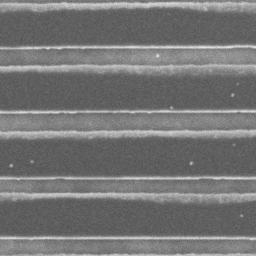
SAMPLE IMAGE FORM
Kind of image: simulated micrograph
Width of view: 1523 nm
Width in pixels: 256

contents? lines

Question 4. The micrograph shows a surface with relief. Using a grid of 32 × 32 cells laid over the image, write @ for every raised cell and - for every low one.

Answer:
---------------------@----------
@@@@@@@@@@@@@@@@@@@@@@@@@@@@@@@@
@@@@@@@@@@@@@@@@@@@@@@@@@@@@@@@@
@@@@@@@@@@@@@@@@@@@@@@@@@@@@@@@@
@@@@@@@@@@@@@@@@@@@@@@@@@@@@@@@@
@@@@@@@@@@@@@@@@@@@@@@@@@@@@@@@@
--------------------------------
--------------------------------
-@@@@--@@@@@-@@@@---------------
@@@@@@@@@@@@@@@@@@@@@@@@@@@@@@@@
@@@@@@@@@@@@@@@@@@@@@@@@@@@@@@@@
@@@@@@@@@@@@@@@@@@@@@@@@@@@@@@@@
@@@@@@@@@@@@@@@@@@@@@@@@@@@@@@@@
@@@@@@@@@@@@@@@@@@@@@@@@@@@@@@@@
--------------------------------
--------------------------------
--------------------------------
@@@@@@@@@@@@@@@@@@@@@@@@@@@@@@@@
@@@@@@@@@@@@@@@@@@@@@@@@@@@@@@@@
@@@@@@@@@@@@@@@@@@@@@@@@@@@@@@@@
@@@@@@@@@@@@@@@@@@@@@@@@@@@@@@@@
@@@@@@@@@@@@@@@@@@@@@@@@@@@@@@@@
--------------------------------
--------------------------------
@@@@@@@@@@@@@@@@@@--------------
@@@@@@@@@@@@@@@@@@@@@@@@@@@@@@@@
@@@@@@@@@@@@@@@@@@@@@@@@@@@@@@@@
@@@@@@@@@@@@@@@@@@@@@@@@@@@@@@@@
@@@@@@@@@@@@@@@@@@@@@@@@@@@@@@@@
@@@@@@@@@@@@@@@@@@@@@@@@@@@@@@@@
--------------------------------
--------------------------------